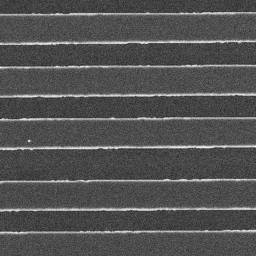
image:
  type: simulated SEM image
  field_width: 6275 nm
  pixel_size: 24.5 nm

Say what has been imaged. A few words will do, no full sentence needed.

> lines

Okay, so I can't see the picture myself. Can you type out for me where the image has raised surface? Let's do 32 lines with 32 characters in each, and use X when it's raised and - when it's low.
--------------------------------
--------------------------------
XXXXXXXXXXXXXXXXXXXXXXXXXXXXXXXX
XXXXXXXXXXXXXXXXXXXXXXXXXXXXXXXX
XXXXXXXXXXXXXXXXXXXXXXXXXXXXXXXX
XXXXXXX-------------------------
--------------------------------
--------------------------------
XXXXXXXXXXXXXXXXXXXXXXXXXXXXXXXX
XXXXXXXXXXXXXXXXXXXXXXXXXXXXXXXX
XXXXXXXXXXXXXXXXXXXXXXXXXXXXXXXX
XXXXXXXXXXXXXXXXXXXXXXXXXXXXXXXX
--------------------------------
--------------------------------
--------------------------------
XXXXXXXXXXXXXXXXXXXXXXXXXXXXXXXX
XXXXXXXXXXXXXXXXXXXXXXXXXXXXXXXX
XXXXXXXXXXXXXXXXXXXXXXXXXXXXXXXX
XXXXXXXXXXXXX-------------------
--------------------------------
--------------------------------
--------------------------------
--------------------XXXXXXXXXXXX
XXXXXXXXXXXXXXXXXXXXXXXXXXXXXXXX
XXXXXXXXXXXXXXXXXXXXXXXXXXXXXXXX
XXXXXXXXXXXXXXXXXXXXXXXXXXXXXXXX
--------------------------------
--------------------------------
--------------------------------
XXXXXXXXXXXXXXXXXXXXXXXXXXXXXXXX
XXXXXXXXXXXXXXXXXXXXXXXXXXXXXXXX
XXXXXXXXXXXXXXXXXXXXXXXXXXXXXXXX